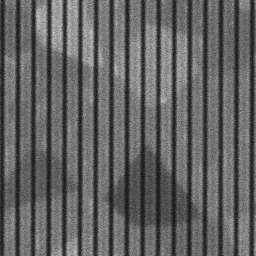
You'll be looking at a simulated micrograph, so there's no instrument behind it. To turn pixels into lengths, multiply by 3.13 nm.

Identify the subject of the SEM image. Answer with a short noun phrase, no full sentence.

parallel lines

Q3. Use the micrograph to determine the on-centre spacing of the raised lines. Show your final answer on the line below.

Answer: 48.9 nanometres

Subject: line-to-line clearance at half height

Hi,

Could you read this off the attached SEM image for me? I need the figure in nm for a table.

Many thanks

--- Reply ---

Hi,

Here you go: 17.6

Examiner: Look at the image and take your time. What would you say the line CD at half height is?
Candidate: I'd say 32.5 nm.